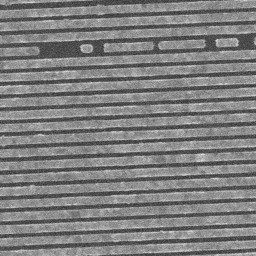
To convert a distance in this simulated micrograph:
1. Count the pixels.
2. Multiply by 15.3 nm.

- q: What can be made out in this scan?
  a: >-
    parallel lines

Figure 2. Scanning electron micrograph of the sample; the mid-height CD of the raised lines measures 120 nm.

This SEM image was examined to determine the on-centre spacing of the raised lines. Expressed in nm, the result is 194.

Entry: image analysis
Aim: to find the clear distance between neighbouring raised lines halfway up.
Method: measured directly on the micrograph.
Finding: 70.7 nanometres